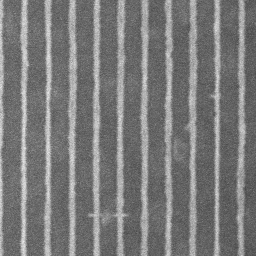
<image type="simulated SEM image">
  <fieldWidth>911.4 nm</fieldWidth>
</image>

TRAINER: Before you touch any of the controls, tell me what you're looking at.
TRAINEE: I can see parallel lines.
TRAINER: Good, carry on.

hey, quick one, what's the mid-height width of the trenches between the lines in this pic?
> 19.4 pixels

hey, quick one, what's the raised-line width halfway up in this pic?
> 0.0174 micrometres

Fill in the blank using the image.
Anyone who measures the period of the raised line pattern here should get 85.9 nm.